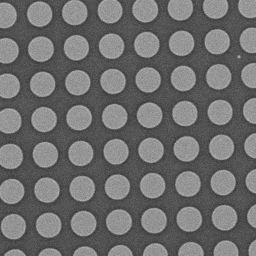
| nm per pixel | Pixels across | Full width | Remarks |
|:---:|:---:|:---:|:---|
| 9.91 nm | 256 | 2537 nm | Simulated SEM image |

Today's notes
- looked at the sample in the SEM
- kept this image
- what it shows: an array of small figures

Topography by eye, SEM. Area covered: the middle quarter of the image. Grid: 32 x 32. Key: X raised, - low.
--------------------------------
-----------XX------XXXX-----XXXX
-XXXXX----XXXXX---XXXXXX---XXXXX
-XXXXX---XXXXXX---XXXXXX---XXXXX
XXXXXX---XXXXXX---XXXXXX---XXXXX
-XXXXX---XXXXXX---XXXXXX---XXXXX
-XXXXX----XXXXX----XXXX------XX-
--XXX---------------------------
--------------------------------
-----------------------------XX-
---X-------XXX-----XXXX-----XXXX
-XXXXX----XXXXX----XXXXX---XXXXX
-XXXXXX---XXXXXX--XXXXXX---XXXXX
-XXXXXX---XXXXXX--XXXXXX---XXXXX
-XXXXXX---XXXXX----XXXXX----XXXX
-XXXXX-----XXXX-----XXX---------
--------------------------------
--------------------------------
-----------------------------XXX
---XX------XXXX----XXXXX----XXXX
--XXXXX---XXXXXX---XXXXXX---XXXX
-XXXXXX---XXXXXX---XXXXXX---XXXX
-XXXXXX---XXXXXX---XXXXXX---XXXX
-XXXXXX---XXXXXX---XXXXX-----XXX
--XXXX-----XXXX------XX---------
--------------------------------
--------------------------------
---------------------XX------XXX
---XXX-----XXXX-----XXXX----XXXX
--XXXXX----XXXXX---XXXXXX---XXXX
--XXXXX---XXXXXX---XXXXXX---XXXX
--XXXXXX--XXXXXX---XXXXXX---XXXX